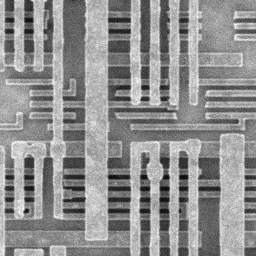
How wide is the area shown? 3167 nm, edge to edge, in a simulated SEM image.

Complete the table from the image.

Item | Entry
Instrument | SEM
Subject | wiring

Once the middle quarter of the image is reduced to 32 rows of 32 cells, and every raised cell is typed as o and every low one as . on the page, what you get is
.....oooooo......oo...oo...oo...
.....oooooo......oo...oo..ooo...
.....oooooo......oo...oo..ooo...
.....oooooo......oo...oo..ooo...
.....oooooo......oo...oo...oo...
.....oooooo......oo...oo...oo...
......ooooo......oo...oo...oo...
.....oooooo......oo...oo...oo...
.....oooooo......oo...oo...oo...
.....oooooo......oo...oo...oo...
.....oooooo.....................
.....oooooo.....................
.....oooooo.....................
.....oooooo.....................
.....oooooo.....................
.....oooooo.....................
.....oooooo.....................
.....oooooo.....................
.....oooooo.....................
.....oooooo...................oo
.....oooooo......ooooooo...ooooo
.....oooooo......ooooooo...ooooo
.....oooooo......oo...oo...oo..o
.....oooooo......oo...oo...oo..o
.....oooooo......oo..ooo...oo..o
.....oooooo......oo..ooo...oo..o
.....oooooo......oo..oooo.ooo..o
.....oooooo......oo..oooo.ooo..o
.....oooooo......oo..ooo...oo..o
.....oooooo......oo...oo...oo..o
.....oooooo......oo...oo...oo..o
.....oooooo......oo...oo...oo..o